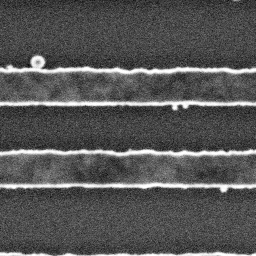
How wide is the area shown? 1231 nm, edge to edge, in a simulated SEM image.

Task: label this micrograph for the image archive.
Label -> lines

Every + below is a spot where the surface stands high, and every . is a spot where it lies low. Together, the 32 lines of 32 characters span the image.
................................
................................
................................
................................
................................
................................
................................
................................
....+...........................
++++++++++++++++++++++++++++++++
++++++++++++++++++++++++++++++++
++++++++++++++++++++++++++++++++
++++++++++++++++++++++++++++++++
................................
................................
................................
................................
................................
................................
++++++++++++++++++++++++++++++++
++++++++++++++++++++++++++++++++
++++++++++++++++++++++++++++++++
++++++++++++++++++++++++++++++++
................................
................................
................................
................................
................................
................................
................................
................................
................................